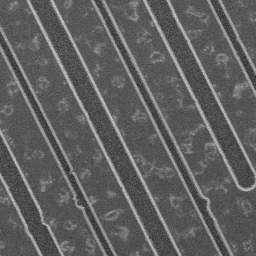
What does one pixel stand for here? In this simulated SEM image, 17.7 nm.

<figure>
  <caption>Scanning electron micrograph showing parallel lines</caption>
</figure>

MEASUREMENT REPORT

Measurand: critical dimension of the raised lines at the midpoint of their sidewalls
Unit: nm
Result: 648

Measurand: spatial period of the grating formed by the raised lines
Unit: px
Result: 52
